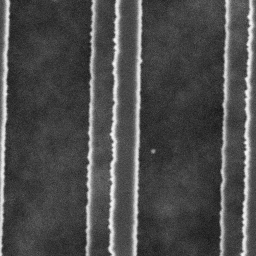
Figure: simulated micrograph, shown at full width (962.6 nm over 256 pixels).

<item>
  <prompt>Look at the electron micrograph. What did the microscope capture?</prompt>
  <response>lines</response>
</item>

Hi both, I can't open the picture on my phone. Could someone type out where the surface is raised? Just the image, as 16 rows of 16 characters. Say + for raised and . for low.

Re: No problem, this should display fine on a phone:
+.....+++.....++
+.....+++.....++
+.....+++.....++
......+++.....++
......+++.....++
......+++.....++
......+++.....++
......+++.....++
......+++.....++
......+++.....++
......+++.....++
......+++.....++
......+++.....++
.....++++.....++
.....++++.....++
.....++++.....++